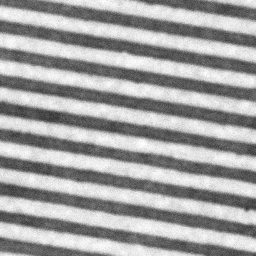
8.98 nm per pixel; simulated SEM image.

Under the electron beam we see parallel lines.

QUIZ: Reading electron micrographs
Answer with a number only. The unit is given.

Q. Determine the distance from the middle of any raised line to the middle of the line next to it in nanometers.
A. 240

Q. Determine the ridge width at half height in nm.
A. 110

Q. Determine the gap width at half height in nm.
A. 126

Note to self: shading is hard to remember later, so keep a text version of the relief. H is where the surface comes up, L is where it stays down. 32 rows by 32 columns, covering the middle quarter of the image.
LLLLLLLLLLLLLLLHHHHHHHHHHHHHHHHH
LLLLLLLLLLLLLLLLLLLLLHHHHHHHHHHH
HHHLLLLLLLLLLLLLLLLLLLLLLLLHHHHH
HHHHHHHHHLLLLLLLLLLLLLLLLLLLLLLL
HHHHHHHHHHHHHHHHHLLLLLLLLLLLLLLL
LLLHHHHHHHHHHHHHHHHHHHHLLLLLLLLL
LLLLLLLLLHHHHHHHHHHHHHHHHHHHHLLL
LLLLLLLLLLLLLLLLHHHHHHHHHHHHHHHH
LLLLLLLLLLLLLLLLLLLLLLHHHHHHHHHH
HHHHLLLLLLLLLLLLLLLLLLLLLLLLHHHH
HHHHHHHHHHHLLLLLLLLLLLLLLLLLLLLL
HHHHHHHHHHHHHHHHLLLLLLLLLLLLLLLL
LLLLHHHHHHHHHHHHHHHHHHHLLLLLLLLL
LLLLLLLLLLHHHHHHHHHHHHHHHHHHHLLL
LLLLLLLLLLLLLLLLHHHHHHHHHHHHHHHH
LHLLLLLLLLLLLLLLLLLLLLHHHHHHHHHH
HHHHHHLLLLLLLLLLLLLLLLLLLLLLHHHH
HHHHHHHHHHHHHHLLLLLLLLLLLLLLLLLL
LHHHHHHHHHHHHHHHHHLHLLLLLLLLLLLL
LLLLLHLHHHHHHHHHHHHHHHHHLLLLLLLL
LLLLLLLLLLLHHHHHHHHHHHHHHHHHHHHH
LLLLLLLLLLLLLLLLLHHHHHHHHHHHHHHH
HLLLLLLLLLLLLLLLLLLLLLLLLHHHHHHH
HHHHHHHLLLLLLLLLLLLLLLLLLLLLLHHH
HHHHHHHHHHHHHLLLLLLLLLLLLLLLLLLL
LHHHHHHHHHHHHHHHHHHLLLLLLLLLLLLL
LLLLLLLHHHHHHHHHHHHHHHHHHLLLLLLL
LLLLLLLLLLLLLHHHHHHHHHHHHHHHHHHL
LLLLLLLLLLLLLLLLLLLHHHHHHHHHHHHH
HHHLLLLLLLLLLLLLLLLLLLLLLHHHHHHH
HHHHHHHHHLLLLLLLLLLLLLLLLLLLLLLH
HHHHHHHHHHHHHHHLLLLLLLLLLLLLLLLL